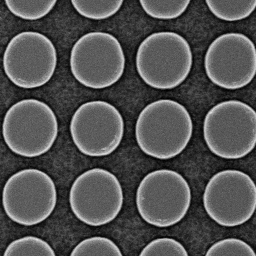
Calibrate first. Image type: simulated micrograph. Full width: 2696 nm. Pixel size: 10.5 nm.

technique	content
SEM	a regular array of raised bodies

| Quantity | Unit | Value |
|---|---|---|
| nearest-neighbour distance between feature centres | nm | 704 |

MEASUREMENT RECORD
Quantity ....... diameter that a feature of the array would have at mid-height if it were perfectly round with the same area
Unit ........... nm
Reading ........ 577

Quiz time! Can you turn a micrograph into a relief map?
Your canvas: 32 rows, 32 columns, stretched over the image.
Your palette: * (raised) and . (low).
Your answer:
.******..******...*****...******
..****....****....*****....****.
............................*...
................................
..***......***.....***......**..
.*****...******...*****....*****
.******..******..*******..******
.******..*******.*******..******
.******..******..*******..******
.*****...******...*****...******
..***......***.....***.....****.
................................
...*............................
.*****....****....*****....****.
.******..******..*******..******
*******..******..*******..******
*******..******..*******..******
.******..******..*******..******
.*****....****....*****...******
...*...............***......**..
................................
...**......**......***......**..
.*****....*****...*****...*****.
.******..******..*******..******
*******..******..*******.*******
*******..******..*******.*******
.*****...******..******...******
..***.....****....****.....****.
................................
................................
.*****....****.....***.....****.
.******..******...*****...******